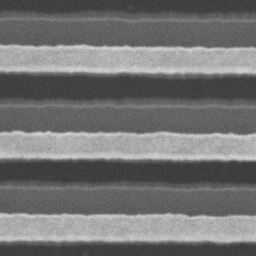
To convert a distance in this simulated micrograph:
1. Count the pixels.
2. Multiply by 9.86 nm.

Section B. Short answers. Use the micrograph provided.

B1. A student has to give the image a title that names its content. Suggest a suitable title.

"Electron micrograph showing lines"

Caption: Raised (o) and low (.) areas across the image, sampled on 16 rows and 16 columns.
................
oooooooooooooooo
oooooooooooooooo
oooooooooooooooo
oooooooooooooooo
................
................
oooooooooooooooo
oooooooooooooooo
oooooooooooooooo
................
................
oooooooooooooooo
oooooooooooooooo
oooooooooooooooo
................